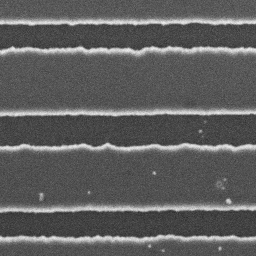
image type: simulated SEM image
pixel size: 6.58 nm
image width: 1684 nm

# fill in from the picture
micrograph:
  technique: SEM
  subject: lines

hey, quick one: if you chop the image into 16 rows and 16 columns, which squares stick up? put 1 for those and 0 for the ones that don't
1111111111111111
0100000000000000
0000000000000000
1111111111111111
1111111111111111
1111111111111111
1111111111111111
0000000000000000
0000000000000000
1111111111111111
1111111111111111
1111111111111111
1111111111111111
0000000000000000
0000000000000000
1111111111111111